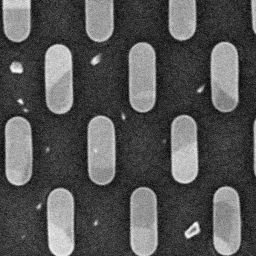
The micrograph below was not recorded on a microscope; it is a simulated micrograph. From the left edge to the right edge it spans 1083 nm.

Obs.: groups of lines, slits or small figures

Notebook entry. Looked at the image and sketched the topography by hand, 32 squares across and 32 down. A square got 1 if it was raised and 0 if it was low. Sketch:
11110000000111000000011100000000
11110000000111000000011100000000
11110000000111000000011100000000
01110000000111000000011100000000
01100000000111000000001100000000
00000000000000000100000000011000
00000011100000001110000000011100
00000011100000001110000000111100
00000011100000001110000000111100
00000011100000001110000000111100
00000011100000001110000000111100
00000011100000001110000000011100
00000011100000001110000000011100
00000011100000000110000000011000
00000000000000000000000000000000
01110000000111000000001100000000
01110000000111000000001100000000
01110000000111000000001110000000
01110000000111000000001110000000
01110000000111000000001110000000
01110000000111000000001110000000
01110000000111000000001110000000
01110000000011000000001100000000
00000000000000000100000000001000
00000011100000000110000000011100
00000011100000001110000000011100
00000011100000001110000000011100
00000011100000001110000000011100
00000011100000001111000000011100
00000011100000001111000000011100
00000011100000001111000000011100
00000001100000000110000000011000